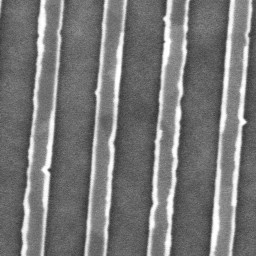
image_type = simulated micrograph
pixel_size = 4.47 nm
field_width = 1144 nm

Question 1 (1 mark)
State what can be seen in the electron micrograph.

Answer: one or a few lines or trenches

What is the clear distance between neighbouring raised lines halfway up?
190 nanometres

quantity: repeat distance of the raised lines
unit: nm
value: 280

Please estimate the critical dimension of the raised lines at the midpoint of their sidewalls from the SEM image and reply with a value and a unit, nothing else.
0.0914 micrometres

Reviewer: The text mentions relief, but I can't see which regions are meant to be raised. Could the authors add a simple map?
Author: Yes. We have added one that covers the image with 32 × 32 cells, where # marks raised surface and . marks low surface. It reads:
.....###.....###.....##......##.
.....###.....###.....##......##.
.....###.....###.....##......##.
.....###.....##......##......##.
.....##......##......##......##.
.....##......##......##.....###.
.....##......##......##.....###.
.....##......##......##.....###.
.....##......##.....###.....###.
.....##.....###.....###.....###.
.....##.....###.....###.....###.
....###.....###.....###.....##..
....###.....###.....##......##..
....###.....###.....##......##..
....###.....###.....##......##..
....###.....##......##......##..
....###.....##......##.....###..
....##......##......##......##..
....##......##......##.....###..
....##......##.....###.....###..
....##......##.....###.....###..
....##......##.....###.....###..
...###.....###.....###.....###..
...###.....###.....###.....##...
...###.....###.....###.....##...
...###.....###.....##......##...
...###.....###.....##......##...
...###.....##......##......##...
...###.....##......##......##...
...##......##......##......##...
...##......##......##.....###...
...##......##......##.....###...